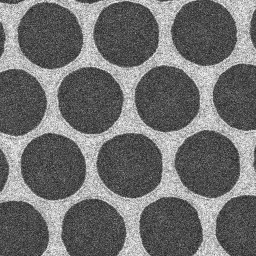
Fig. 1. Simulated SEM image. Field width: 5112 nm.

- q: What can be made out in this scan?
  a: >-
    holes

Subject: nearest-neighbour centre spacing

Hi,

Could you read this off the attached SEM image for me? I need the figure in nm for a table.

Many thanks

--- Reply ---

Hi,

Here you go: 1510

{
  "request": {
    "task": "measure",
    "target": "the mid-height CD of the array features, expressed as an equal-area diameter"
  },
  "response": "1330 nanometres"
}